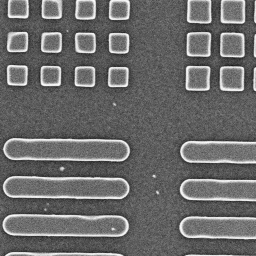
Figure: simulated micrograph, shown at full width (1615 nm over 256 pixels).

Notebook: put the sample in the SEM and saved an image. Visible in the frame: groups of lines, slits or small figures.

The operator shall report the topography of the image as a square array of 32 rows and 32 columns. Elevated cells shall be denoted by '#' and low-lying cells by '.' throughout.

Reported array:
.##..###..##..##........##..###.
.##..###..##..##........##..###.
........................##..###.
................................
.##..###..##..##........##..##..
.##..###..##..##.......###..##..
......#...##..##.......###..##..
................................
.##..##...##..##........##..##..
.##..###.###..##.......###..##..
.##..##...##..##.......###..##..
................................
................................
................................
................................
................................
................................
.#############..................
.###############.......#########
.###############.......#########
................................
................................
.##############.................
.###############.......#########
.###############.......#########
................................
................................
.###############.......#########
.###############.......#########
.............##........#########
................................
................................